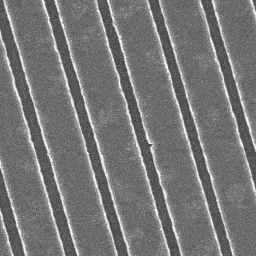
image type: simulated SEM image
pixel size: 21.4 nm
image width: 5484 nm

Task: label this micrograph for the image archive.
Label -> parallel lines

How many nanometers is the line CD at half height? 838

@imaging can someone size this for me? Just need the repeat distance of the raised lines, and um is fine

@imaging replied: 1.07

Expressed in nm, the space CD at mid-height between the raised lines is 239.